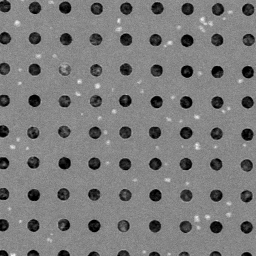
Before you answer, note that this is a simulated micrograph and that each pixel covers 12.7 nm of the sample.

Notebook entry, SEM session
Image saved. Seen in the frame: a regular array of holes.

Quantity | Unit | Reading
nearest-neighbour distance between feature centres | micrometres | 0.384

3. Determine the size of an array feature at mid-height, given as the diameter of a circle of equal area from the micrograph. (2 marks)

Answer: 160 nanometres